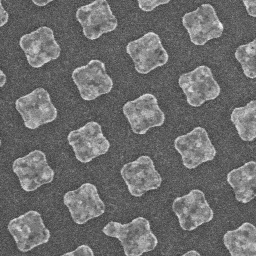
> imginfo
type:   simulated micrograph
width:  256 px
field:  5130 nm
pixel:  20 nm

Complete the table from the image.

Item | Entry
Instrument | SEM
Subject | a regular array of raised bodies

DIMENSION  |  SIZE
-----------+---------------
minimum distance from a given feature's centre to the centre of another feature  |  1230 nm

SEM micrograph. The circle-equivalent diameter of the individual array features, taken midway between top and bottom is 0.726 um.